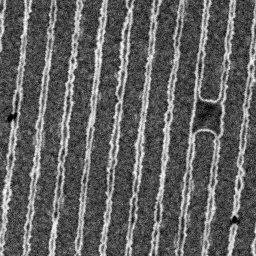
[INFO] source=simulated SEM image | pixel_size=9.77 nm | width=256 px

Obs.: parallel lines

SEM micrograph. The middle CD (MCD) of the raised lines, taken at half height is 0.0509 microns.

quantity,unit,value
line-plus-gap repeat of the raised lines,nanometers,248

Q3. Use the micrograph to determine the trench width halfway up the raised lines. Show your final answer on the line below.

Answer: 194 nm